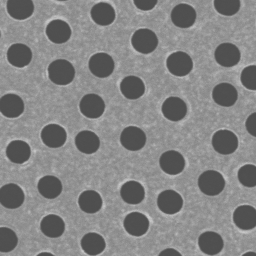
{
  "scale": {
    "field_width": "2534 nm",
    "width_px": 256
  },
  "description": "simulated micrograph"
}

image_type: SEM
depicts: a regular array of holes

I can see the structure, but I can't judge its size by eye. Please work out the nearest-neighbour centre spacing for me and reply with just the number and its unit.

0.396 um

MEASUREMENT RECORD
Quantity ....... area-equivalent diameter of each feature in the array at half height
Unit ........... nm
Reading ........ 252